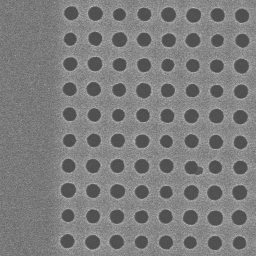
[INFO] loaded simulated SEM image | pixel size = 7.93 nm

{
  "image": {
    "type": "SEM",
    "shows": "a regular array of holes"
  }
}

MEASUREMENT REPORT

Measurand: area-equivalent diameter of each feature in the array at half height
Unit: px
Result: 14.3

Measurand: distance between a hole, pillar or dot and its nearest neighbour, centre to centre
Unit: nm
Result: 192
